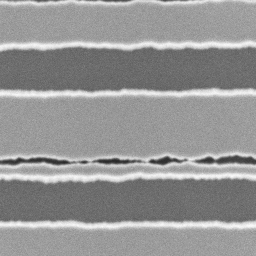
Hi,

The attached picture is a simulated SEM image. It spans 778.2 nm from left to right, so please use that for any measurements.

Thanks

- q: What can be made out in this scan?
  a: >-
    lines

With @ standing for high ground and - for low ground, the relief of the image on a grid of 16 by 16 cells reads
@@@@@@@@@@@@@@@@
@@@@@@@@@@@@@@@@
@@@@@@@@@@@@@@@@
----------------
----------------
----------------
@@@@@@@@@@@@@@@@
@@@@@@@@@@@@@@@@
@@@@@@@@@@@@@@@@
@@@@@@@@@@@@@@@@
@@@@@@@@@@@@@@@@
----------------
----------------
----------------
@@@@@@@@@@@@@@@@
@@@@@@@@@@@@@@@@